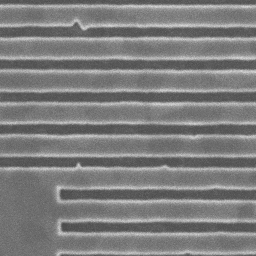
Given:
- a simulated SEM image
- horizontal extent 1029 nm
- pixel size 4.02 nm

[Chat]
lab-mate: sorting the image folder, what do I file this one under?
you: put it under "parallel lines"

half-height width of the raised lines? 83 nm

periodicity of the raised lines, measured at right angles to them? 32.6 pixels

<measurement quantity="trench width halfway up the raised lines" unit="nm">47.3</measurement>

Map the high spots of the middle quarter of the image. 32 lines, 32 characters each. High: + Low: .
................................
................................
++++++++++++++++++++++++++++++++
++++++++++++++++++++++++++++++++
++++++++++++++++++++++++++++++++
++++++++++++++++++++++++++++++++
++++++++++++++++++++++++++++++++
................................
................................
................................
++++++++++++++++++++++++++++++++
++++++++++++++++++++++++++++++++
++++++++++++++++++++++++++++++++
++++++++++++++++++++++++++++++++
++++++++++++++++++++++++++++++++
................................
................................
................................
++++++++++++++++++++++++++++++++
++++++++++++++++++++++++++++++++
++++++++++++++++++++++++++++++++
++++++++++++++++++++++++++++++++
++++++++++++++++++++++++++++++++
................................
................................
...+............................
++++++++++++++++++++++++++++++++
++++++++++++++++++++++++++++++++
++++++++++++++++++++++++++++++++
++++++++++++++++++++++++++++++++
++++++++++++++++++++++++++++++++
................................